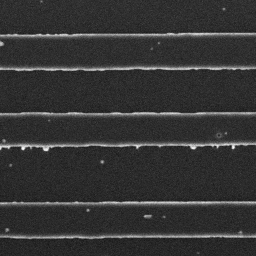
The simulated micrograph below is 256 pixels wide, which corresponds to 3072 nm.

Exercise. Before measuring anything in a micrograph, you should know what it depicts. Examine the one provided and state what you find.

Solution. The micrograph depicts lines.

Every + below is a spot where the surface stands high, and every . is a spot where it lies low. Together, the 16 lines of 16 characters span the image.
................
................
++++++++++++++++
++++++++++++++++
................
................
................
++++++++++++++++
++++++++++++++++
................
................
................
................
++++++++++++++++
++++++++++++++++
................